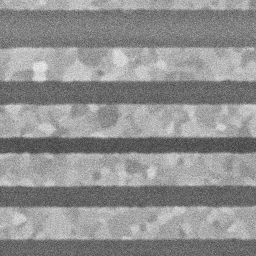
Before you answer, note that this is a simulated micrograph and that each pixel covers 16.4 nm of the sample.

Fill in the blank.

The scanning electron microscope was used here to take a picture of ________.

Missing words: lines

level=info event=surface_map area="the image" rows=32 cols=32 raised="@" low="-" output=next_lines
@@@@@@@@@@@@@@@@@@@@@@@@@@@@@@@@
--------------------------------
--------------------------------
--------------------------------
--------------------------------
--------------------------------
@@@@@@@@@@@@@@@@@@@@@@@@@@@@@@@@
@@@@@@@@@@@@@@@@@@@@@@@@@@@@@@@@
@@@@@@@@@@@@@@@@@@@@@@@@@@@@@@@@
@@@@@@@@@@@@@@@@@@@@@@@@@@@@@@@@
--------------------------------
--------------------------------
--------------------------------
@@@@@@@@@@@@@@@@@@@@@@@@@@@@@@@@
@@@@@@@@@@@@@@@@@@@@@@@@@@@@@@@@
@@@@@@@@@@@@@@@@@@@@@@@@@@@@@@@@
@@@@@@@@@@@@@@@@@@@@@@@@@@@@@@@@
--------------------------------
--------------------------------
@@@@@@@@@@@@@@@@@@@@@@@@@@@@@@@@
@@@@@@@@@@@@@@@@@@@@@@@@@@@@@@@@
@@@@@@@@@@@@@@@@@@@@@@@@@@@@@@@@
@@@@@@@@@@@@@@@@@@@@@@@@@@@@@@@@
--------------------------------
--------------------------------
--------------------------------
@@@@@@@@@@@@@@@@@@@@@@@@@@@@@@@@
@@@@@@@@@@@@@@@@@@@@@@@@@@@@@@@@
@@@@@@@@@@@@@@@@@@@@@@@@@@@@@@@@
@@@@@@@@@@@@@@@@@@@@@@@@@@@@@@@@
--------------------------------
--------------------------------